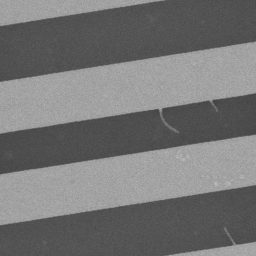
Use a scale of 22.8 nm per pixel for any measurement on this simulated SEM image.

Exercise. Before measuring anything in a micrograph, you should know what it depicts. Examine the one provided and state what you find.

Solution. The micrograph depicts lines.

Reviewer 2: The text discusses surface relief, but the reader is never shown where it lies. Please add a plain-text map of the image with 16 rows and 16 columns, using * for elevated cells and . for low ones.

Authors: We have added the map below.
*******.........
*...............
................
...........*****
....************
****************
************....
*****...........
................
.........*******
...*************
****************
**********......
****............
................
..............**